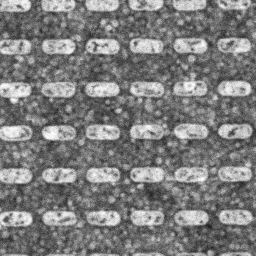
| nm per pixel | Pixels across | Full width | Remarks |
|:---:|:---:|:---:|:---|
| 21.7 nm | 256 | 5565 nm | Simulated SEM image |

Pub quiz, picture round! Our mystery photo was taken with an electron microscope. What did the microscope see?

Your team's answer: a regular array of raised bodies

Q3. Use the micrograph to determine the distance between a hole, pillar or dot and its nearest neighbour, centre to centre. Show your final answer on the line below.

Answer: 924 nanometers